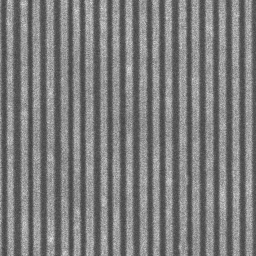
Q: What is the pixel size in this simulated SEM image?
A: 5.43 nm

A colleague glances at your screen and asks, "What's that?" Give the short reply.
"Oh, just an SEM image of parallel lines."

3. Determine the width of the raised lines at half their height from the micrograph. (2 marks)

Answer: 35.3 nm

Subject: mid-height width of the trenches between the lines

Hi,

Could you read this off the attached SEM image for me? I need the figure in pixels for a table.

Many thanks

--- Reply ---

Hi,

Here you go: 6.5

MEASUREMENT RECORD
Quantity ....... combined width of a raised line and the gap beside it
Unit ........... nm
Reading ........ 71.9